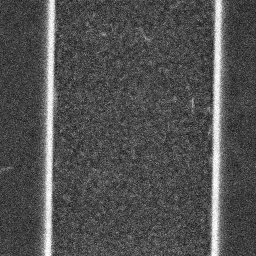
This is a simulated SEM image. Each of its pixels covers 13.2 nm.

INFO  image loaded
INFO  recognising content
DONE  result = one or a few lines or trenches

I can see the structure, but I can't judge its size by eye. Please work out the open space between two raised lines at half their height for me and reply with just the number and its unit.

2190 nanometres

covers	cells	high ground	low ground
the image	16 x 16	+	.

+++...........++
+++...........++
+++...........++
+++...........++
+++...........++
+++...........++
+++...........++
+++...........++
+++...........++
+++...........++
+++..........+++
+++..........+++
+++..........+++
+++..........+++
+++..........+++
+++..........+++